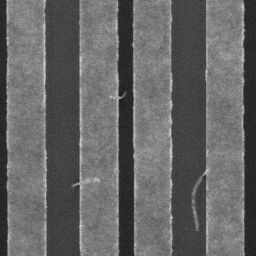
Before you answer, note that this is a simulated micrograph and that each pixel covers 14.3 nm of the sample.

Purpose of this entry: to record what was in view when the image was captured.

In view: lines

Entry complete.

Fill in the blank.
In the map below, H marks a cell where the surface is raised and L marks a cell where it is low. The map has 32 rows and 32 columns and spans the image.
LHHHHHLLLLHHHHHLLHHHHLLLLLHHHHLL
LHHHHLLLLLHHHHHLLHHHHLLLLLHHHHLL
LHHHHHLLLLHHHHHLLHHHHLLLLLHHHHLL
LHHHHHLLLLHHHHHLLHHHHLLLLLHHHHLL
LHHHHHLLLLHHHHHLLHHHHLLLLLHHHHLL
LHHHHHLLLLHHHHHLLHHHHLLLLLHHHHLL
LHHHHHLLLLHHHHHLLHHHHLLLLLHHHHLL
LHHHHHLLLLHHHHHLLHHHHLLLLLHHHHLL
LHHHHHLLLLHHHHHLLHHHHLLLLLHHHHLL
LHHHHHLLLLHHHHHLLHHHHLLLLLHHHHLL
LHHHHHLLLLHHHHHLLHHHHLLLLLHHHHLL
LHHHHHLLLLHHHHHLLHHHHLLLLLHHHHLL
LHHHHHLLLLHHHHHLLHHHHLLLLLHHHHLL
LHHHHHLLLLHHHHHLLHHHHLLLLLHHHHLL
LHHHHHLLLLHHHHHLLHHHHLLLLLHHHHLL
LHHHHHLLLLHHHHHLLHHHHLLLLLHHHHLL
LHHHHHLLLLHHHHHLLHHHHLLLLLHHHHLL
LHHHHHLLLLHHHHHLLHHHHLLLLLHHHHLL
LHHHHHLLLLHHHHHLLHHHHLLLLLHHHHLL
LHHHHHLLLLHHHHHLLHHHHLLLLLHHHHLL
LHHHHHLLLLHHHHHLLHHHHLLLLLHHHHLL
LHHHHHLLLLHHHHHLLHHHHLLLLLHHHHLL
LHHHHHLLLLHHHHHLLHHHHLLLLLHHHHLL
LHHHHHLLLLHHHHHLLHHHHLLLLLHHHHLL
LHHHHHLLLLHHHHHLLHHHHLLLLLHHHHLL
LHHHHHLLLLHHHHHLLHHHHLLLLLHHHHLL
LHHHHHLLLLHHHHHLLHHHHLLLLLHHHHLL
LHHHHHLLLLHHHHHLLHHHHLLLLLHHHHLL
LHHHHHLLLLHHHHHLLHHHHLLLLLHHHHLL
LHHHHHLLLLHHHHHLLHHHHLLLLLHHHHLL
LHHHHHLLLLHHHHHLLHHHHLLLLLHHHHLL
LHHHHHLLLLHHHHHLLHHHHLLLLLHHHHHL